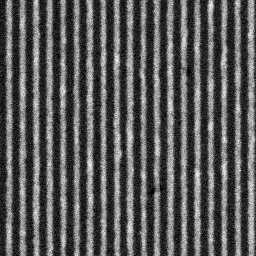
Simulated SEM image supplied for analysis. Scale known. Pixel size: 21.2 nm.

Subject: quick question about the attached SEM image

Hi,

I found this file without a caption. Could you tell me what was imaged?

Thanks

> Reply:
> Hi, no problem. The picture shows parallel lines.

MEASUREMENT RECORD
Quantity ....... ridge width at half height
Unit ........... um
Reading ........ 0.0903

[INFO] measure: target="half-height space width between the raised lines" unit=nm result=197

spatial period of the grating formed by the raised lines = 286 nm